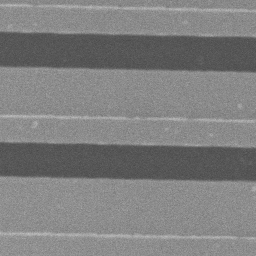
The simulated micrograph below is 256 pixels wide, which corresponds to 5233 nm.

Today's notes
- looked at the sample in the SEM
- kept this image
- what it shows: lines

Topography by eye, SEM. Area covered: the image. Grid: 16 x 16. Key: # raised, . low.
################
################
................
................
############....
################
################
################
################
................
................
################
################
################
################
################